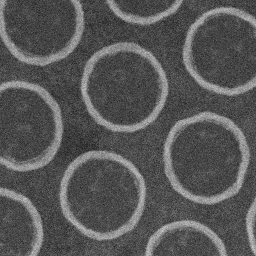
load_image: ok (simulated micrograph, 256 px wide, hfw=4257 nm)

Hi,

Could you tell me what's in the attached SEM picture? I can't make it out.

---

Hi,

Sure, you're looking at raised bodies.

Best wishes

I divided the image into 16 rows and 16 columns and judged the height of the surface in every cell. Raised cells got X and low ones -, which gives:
XXXXX--XXXX-----
XXXXX-------XXXX
XXXXX-------XXXX
-XXX--XXX---XXXX
-----XXXXX--XXXX
XX---XXXXX---XX-
XXX---XXXX------
XXXX--XXX---XX--
XXXX-------XXXX-
XXX-------XXXXX-
-----XXX---XXXX-
----XXXXX--XXXX-
X---XXXXX-------
XX--XXXX--------
XX----X---XXX---
XX-------XXXXX--